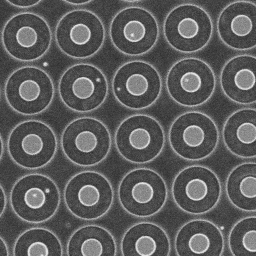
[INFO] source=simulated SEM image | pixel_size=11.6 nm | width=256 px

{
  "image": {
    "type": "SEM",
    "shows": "an array of small figures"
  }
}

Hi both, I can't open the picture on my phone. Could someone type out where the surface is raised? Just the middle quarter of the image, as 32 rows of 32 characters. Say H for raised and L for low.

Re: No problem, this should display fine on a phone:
HHHLLLLHHHHHHHHLLLLLLLHHHHHHLLLL
HLLLLLLLHHHHHHLLLLLLLLLHHHHLLLLL
LLLLLLLLLLHHHLLLLLLLLLLHHHLLLLLH
LLLLHLLLLLHHHLLLHHHHLLLLHHLLLLHH
LLLHHHHLLLHHLLLLHHHHHLLLHHLLLHHH
LLHHHHHLLLLHLLLLHHHHHLLLHHLLLHHH
LLHHHHHLLLLHLLLLHHHHHLLLHHLLLLHH
LLLHHHHLLLHHHLLLLHHLLLLLHHHLLLLL
LLLLLLLLLLHHHLLLLLLLLLLHHHHLLLLL
LLLLLLLLLHHHHHLLLLLLLLHHHHHHLLLL
HLLLLLLLLHHHHHHHLLLLLHHHHHHHHHHH
HHHLLLLHHHHHHHHHHHHHHHHHHHHHHHHH
HHHHHHHHHHHHHHHHHHHHHHHHHHHHHHLL
HHHHHHLHHHHHHHHHLLLLLLHHHHHHHLLL
HHLLLLLLLHHHHHHLLLLLLLLHHHHHLLLL
HLLLLLLLLLHHHHLLLLLLLLLLHHHLLLLL
LLLLLLLLLLLHHLLLLLHHLLLLLHHLLLHH
LLLLHHHLLLLHHLLLLHHHHLLLLHLLLLHH
LLLHHHHHLLLHHLLLLHHHHLLLLHLLLLHH
LLLHHHHHLLLLHLLLLHHHHLLLLHHLLLHH
LLLHHHHHLLLHHLLLLHHHHLLLLHHLLLLL
LLLLHHHLLLLHHHLLLLLLLLLLHHHHLLLL
HLLLLLLLLLLHHHLLLLLLLLLLHHHHHLLL
HLLLLLLLLLHHHHHLLLLLLLHHHHHHHHLL
HHHLLLLLLHHHHHHHHLLLHHHHHHHHHHHH
HHHHHHHHHHHHHHHHHHHHHHHHHHHHHHHH
HHHHHHHHHHHHHHHHHHLLLHHHHHHHHHLL
HHHHLLLLLHHHHHHHLLLLLLLHHHHHHLLL
HHLLLLLLLLHHHHHLLLLLLLLLHHHHLLLL
HLLLLLLLLLLHHHLLLLLLLLLLLHHHLLLL
HLLLLLHLLLLHHHLLLLHHHLLLLHHLLLLH
LLLLHHHHLLLLHHLLLHHHHHLLLLHLLLLH